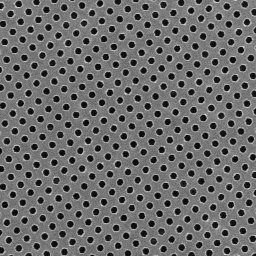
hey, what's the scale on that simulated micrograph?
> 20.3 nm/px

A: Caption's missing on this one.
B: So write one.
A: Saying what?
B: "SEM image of a regular array of holes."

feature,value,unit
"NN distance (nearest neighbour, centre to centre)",0.254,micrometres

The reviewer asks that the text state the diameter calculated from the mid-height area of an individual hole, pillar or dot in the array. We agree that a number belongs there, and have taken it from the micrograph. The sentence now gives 143 nm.